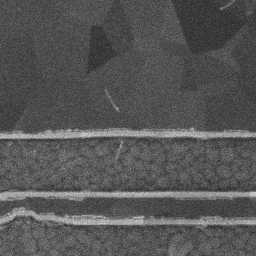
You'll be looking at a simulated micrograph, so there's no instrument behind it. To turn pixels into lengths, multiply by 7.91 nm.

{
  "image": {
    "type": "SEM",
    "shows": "one or a few lines or trenches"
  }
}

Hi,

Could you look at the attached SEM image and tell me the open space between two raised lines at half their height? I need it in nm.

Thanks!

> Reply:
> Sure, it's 468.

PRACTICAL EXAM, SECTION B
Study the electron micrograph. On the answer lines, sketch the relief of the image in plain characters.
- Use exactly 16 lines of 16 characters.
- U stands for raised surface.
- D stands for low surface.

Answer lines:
UUUUUUUUUUUUUUUU
UUUUUUUUUUUUUUUU
UUUUUUUUUUUUUUUU
UUUUUUUUUUUUUUUU
UUUUUUUUUUUUUUUU
UUUUUUUUUUUUUUUU
UUUUUUUUUUUUUUUU
UUUUUUUUUUUUUUUU
UUUUDDDDDDDDDDDD
DDDDDDDDDDDDDDDD
DDDDDDDDDDDDDDDD
DDDDDDDDDDDDDDDD
UUUUUUUUUUUUUUUU
UDUUUUUUUUUUUUUU
DDDDDDDDDDDDDDDD
DDDDDDDDDDDDDDDD